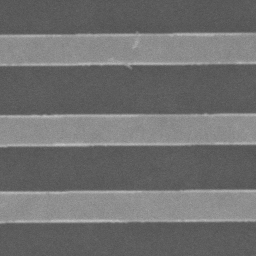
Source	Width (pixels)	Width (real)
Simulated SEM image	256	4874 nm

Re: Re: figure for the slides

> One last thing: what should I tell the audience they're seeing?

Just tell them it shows lines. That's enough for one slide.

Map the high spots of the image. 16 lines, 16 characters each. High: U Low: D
DDDDDDDDDDDDDDDD
DDDDDDDDDDDDDDDD
UUUUUUUUUUUUUUUU
UUUUUUUUUUUUUUUU
DDDDDDDDDDDDDDDD
DDDDDDDDDDDDDDDD
DDDDDDDDDDDDDDDD
UUUUUUUUUUUUUUUU
UUUUUUUUUUUUUUUU
DDDDDDDDDDDDDDDD
DDDDDDDDDDDDDDDD
DDDDDDDDDDDDDDDD
UUUUUUUUUUUUUUUU
UUUUUUUUUUUUUUUU
DDDDDDDDDDDDDDDD
DDDDDDDDDDDDDDDD